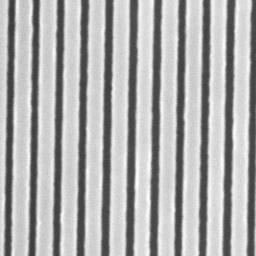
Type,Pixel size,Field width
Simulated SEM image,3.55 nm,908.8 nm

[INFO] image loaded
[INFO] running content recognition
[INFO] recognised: parallel lines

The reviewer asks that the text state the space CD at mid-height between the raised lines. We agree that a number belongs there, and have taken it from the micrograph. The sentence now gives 30.2 nanometres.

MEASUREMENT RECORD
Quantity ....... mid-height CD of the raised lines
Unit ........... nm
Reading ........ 57.3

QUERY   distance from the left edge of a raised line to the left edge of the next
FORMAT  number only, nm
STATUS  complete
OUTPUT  86.4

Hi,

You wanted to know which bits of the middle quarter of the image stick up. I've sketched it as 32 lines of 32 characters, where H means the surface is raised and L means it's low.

HHHHLLHHHHLLHHHHLLLHHHLLHHHHLLLH
HHHHLLHHHHLLHHHHLLHHHHLLHHHHLLHH
HHHHLLHHHHLLHHHHLLHHHHLLHHHHLLHH
HHHHLLHHHHLLHHHHLLHHHHLLHHHHLLHH
HHHHLLHHHHLLHHHHLLHHHHLLHHHHLLHH
HHHHLLHHHHLLHHHHLLHHHHLLHHHHLLHH
HHHHLLHHHHLLHHHHLLHHHHLLHHHHLLHH
HHHHLLHHHHLLHHHHLLHHHHLLHHHHLLHH
HHHHLLHHHHLLHHHHLLHHHHLLHHHHLLHH
HHHHLLHHHHLLHHHHLLHHHHLLHHHHLLHH
HHHHLLHHHHLLHHHHLLHHHHLLHHHHLLHH
HHHHLLHHHHLLHHHHLLHHHHLLHHHHLLHH
HHHLLLHHHHLLHHHHLLHHHHLLHHHHLLHH
HHHHLLHHHHLLHHHHLLHHHHLLHHHHLLHH
HHHHLLHHHHLLHHHHLLHHHHLLHHHHLLHH
HHHHLLHHHHLLHHHHLLHHHHLLHHHHLLHH
HHHHLLHHHHLLHHHHLLHHHHLLHHHHLLHH
HHHHLLHHHHLLHHHHLLHHHHLLHHHHLLHH
HHHHLLHHHHLLHHHHLLHHHHLLHHHHLLHH
HHHHLLHHHLLLHHHHLLHHHHLLHHHHLLHH
HHHLLLHHHHLLHHHHLLHHHHLLHHHHLLHH
HHHHLLHHHHLLHHHHLLHHHHLLHHHHLLHH
HHHLLLHHHLLLHHHHLLHHHHLLHHHHLLHH
HHHLLLHHHLLLHHHHLLHHHHLLHHHHLLHH
HHHLLLHHHLLLHHHHLLHHHHLLHHHHLLHH
HHHLLLHHHLLLHHHHLLHHHHLLHHHHLLHH
HHHLLLHHHLLLHHHHLLHHHHLLHHHHLLHH
HHHLLLHHHLLLHHHHLLHHHLLLHHHHLLHH
HHHLLLHHHHLLHHHHLLHHHLLLHHHHLLHH
HHHLLLHHHHLLHHHHLLHHHLLLHHHHLLHH
HHHLLHHHHHLLHHHLLLHHHLLLHHHHLLHH
HHHLLLHHHLLLHHHLLLHHHLLLHHHHLLHH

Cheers